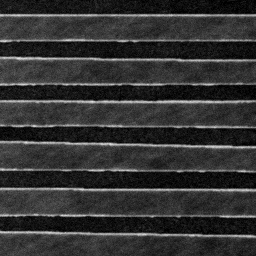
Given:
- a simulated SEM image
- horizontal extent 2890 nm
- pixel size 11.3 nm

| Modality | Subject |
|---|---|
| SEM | lines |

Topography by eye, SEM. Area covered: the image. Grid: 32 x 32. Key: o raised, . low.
................................
................................
oooooooooooooooooooooooooooooooo
oooooooooooooooooooooooooooooooo
oooooooooooooooooooooooooooooooo
................................
................................
oooooooooooooooo................
oooooooooooooooooooooooooooooooo
oooooooooooooooooooooooooooooooo
ooooo...ooooooo.ooooo...ooo.....
................................
................................
oooooooooooooooooooooooooooooooo
oooooooooooooooooooooooooooooooo
oooooooooooooooooooooooooooooooo
................................
................................
oooooooooooooooooooooooooooooooo
oooooooooooooooooooooooooooooooo
oooooooooooooooooooooooooooooooo
................................
................................
................................
oooooooooooooooooooooooooooooooo
oooooooooooooooooooooooooooooooo
oooooooooooooooooooooooooooooooo
................................
................................
ooooooooooooooooooooooooooooo...
oooooooooooooooooooooooooooooooo
oooooooooooooooooooooooooooooooo